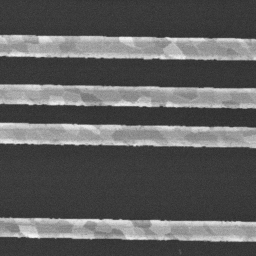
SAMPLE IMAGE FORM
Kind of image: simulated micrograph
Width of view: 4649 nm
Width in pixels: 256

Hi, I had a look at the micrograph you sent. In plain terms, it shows lines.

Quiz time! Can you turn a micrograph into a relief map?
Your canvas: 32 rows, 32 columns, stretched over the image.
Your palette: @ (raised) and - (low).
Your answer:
--------------------------------
--------------------------------
--------------------------------
--------------------------------
--------------------------------
@@@@@@@@@@@@@@@@@@@@@@@@@@@@@@@@
@@@@@@@@@@@@@@@@@@@@@@@@@@@@@@@@
--------------------------------
--------------------------------
--------------------------------
--------------------------------
@@@@@@@@@@@@@@@@@@@@@@@@@@@@@@@@
@@@@@@@@@@@@@@@@@@@@@@@@@@@@@@@@
--------------------------------
--------------------------------
--------------------------------
@@@@@@@@@@@@@@@@@@@@@@@@@@@@@@@@
@@@@@@@@@@@@@@@@@@@@@@@@@@@@@@@@
--------------------------------
--------------------------------
--------------------------------
--------------------------------
--------------------------------
--------------------------------
--------------------------------
--------------------------------
--------------------------------
@@@-----------------------------
@@@@@@@@@@@@@@@@@@@@@@@@@@@@@@@@
----@@@@@@@@@@@@@@@@@@@@@@@@@@@@
--------------------------------
--------------------------------